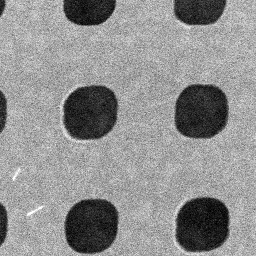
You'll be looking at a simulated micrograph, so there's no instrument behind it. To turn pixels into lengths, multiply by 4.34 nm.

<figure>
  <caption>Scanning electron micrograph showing holes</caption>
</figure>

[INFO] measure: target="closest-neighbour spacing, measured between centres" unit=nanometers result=482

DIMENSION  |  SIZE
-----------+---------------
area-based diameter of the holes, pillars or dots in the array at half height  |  55.4 px